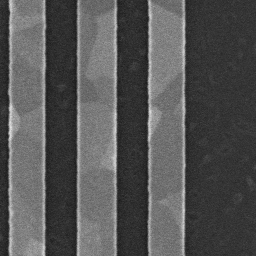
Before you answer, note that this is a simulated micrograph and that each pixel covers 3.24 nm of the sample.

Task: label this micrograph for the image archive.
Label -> one or a few lines or trenches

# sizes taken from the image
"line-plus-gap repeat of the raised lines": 226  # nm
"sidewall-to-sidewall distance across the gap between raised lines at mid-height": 107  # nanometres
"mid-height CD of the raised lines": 115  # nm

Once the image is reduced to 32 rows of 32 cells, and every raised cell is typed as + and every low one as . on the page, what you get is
.++++.....++++.....++++.........
.++++.....++++.....++++.........
.+++++....++++.....++++.........
.+++++....++++.....++++.........
.++++.....++++.....++++.........
.+++++....++++.....++++.........
.+++++....++++.....++++.........
.+++++....++++.....++++.........
.+++++....++++.....++++.........
.++++.....++++.....++++.........
.++++.....++++.....++++.........
.++++.....++++.....++++.........
.++++.....++++.....++++.........
.++++.....++++.....++++.........
.++++.....++++.....++++.........
.++++.....++++.....++++.........
.++++.....++++.....++++.........
.+++++....++++.....++++.........
.++++.....++++.....++++.........
.++++.....++++.....++++.........
.++++.....++++.....++++.........
.++++.....++++.....++++.........
.++++.....++++.....++++.........
.+++++....++++.....++++.........
.+++++....++++.....++++.........
.++++.....++++.....++++.........
.++++.....++++.....++++.........
.++++.....++++.....++++.........
.+++++....++++.....++++.........
.++++.....++++.....++++.........
.++++.....++++.....++++.........
.++++.....++++.....++++.........